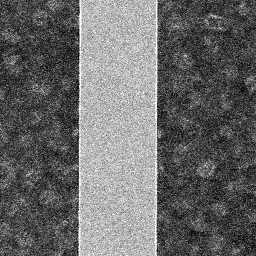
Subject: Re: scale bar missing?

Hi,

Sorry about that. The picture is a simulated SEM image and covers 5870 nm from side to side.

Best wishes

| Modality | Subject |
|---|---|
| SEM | one or a few lines or trenches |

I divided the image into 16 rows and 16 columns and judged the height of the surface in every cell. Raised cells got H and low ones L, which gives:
LLLLLHHHHHLLLLLL
LLLLLHHHHHLLLLLL
LLLLLHHHHHLLLLLL
LLLLLHHHHHLLLLLL
LLLLLHHHHHLLLLLL
LLLLLHHHHHLLLLLL
LLLLLHHHHHLLLLLL
LLLLLHHHHHLLLLLL
LLLLLHHHHHLLLLLL
LLLLLHHHHHLLLLLL
LLLLLHHHHHLLLLLL
LLLLLHHHHHLLLLLL
LLLLLHHHHHLLLLLL
LLLLLHHHHHLLLLLL
LLLLLHHHHHLLLLLL
LLLLLHHHHHLLLLLL